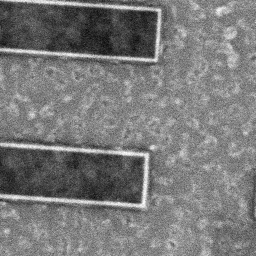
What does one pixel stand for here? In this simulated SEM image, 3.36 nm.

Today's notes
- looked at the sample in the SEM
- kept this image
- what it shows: one or a few lines or trenches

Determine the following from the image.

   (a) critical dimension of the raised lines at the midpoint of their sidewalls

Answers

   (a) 176 nanometres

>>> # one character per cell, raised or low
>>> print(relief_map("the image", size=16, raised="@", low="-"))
@@@@@@@@@-------
@@@@@@@@@@------
@@@@@@@@@@------
-----@@@@@------
----------------
----------------
----------------
----------------
----------------
@@@@@@@---------
@@@@@@@@@-------
@@@@@@@@@-------
---@@@@@@-------
----------------
----------------
----------------